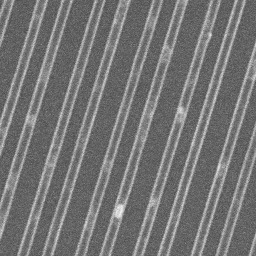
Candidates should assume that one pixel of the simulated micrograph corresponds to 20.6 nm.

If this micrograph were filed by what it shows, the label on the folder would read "parallel lines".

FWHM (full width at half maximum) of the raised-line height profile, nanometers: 192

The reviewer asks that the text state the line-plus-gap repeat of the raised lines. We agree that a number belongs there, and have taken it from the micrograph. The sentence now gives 27.4 px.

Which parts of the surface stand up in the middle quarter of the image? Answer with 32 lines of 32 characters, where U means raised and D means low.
DDDUUDDDDUUDDDDDDUUUDDDUUUDDDDDD
DDUUUDDDDUUDDDDDDUUDDDDUUUDDDDDU
DDUUUDDDUUUDDDDDDUUDDDDUUDDDDDDU
DDUUDDDDUUDDDDDDUUUDDDUUUDDDDDDU
DUUUDDDDUUDDDDDDUUDDDDUUUDDDDDDU
DUUUDDDUUUDDDDDDUUDDDDUUDDDDDDUU
DUUUDDDUUUDDDDDUUUDDDUUUDDDDDDUU
DUUDDDDUUDDDDDDUUUDDDUUUDDDDDDUU
DUUDDDDUUDDDDDDUUDDDDUUUDDDDDUUU
UUUDDDUUUDDDDDDUUDDDDUUDDDDDDUUD
UUDDDDUUDDDDDDUUUDDDUUUDDDDDDUUD
UUDDDDUUDDDDDDUUDDDDUUUDDDDDUUUD
UUDDDUUUDDDDDDUUDDDDUUDDDDDDUUUD
UDDDDUUDDDDDDUUUDDDUUUDDDDDDUUDD
UDDDDUUDDDDDDUUDDDDUUUDDDDDDUUDD
UDDDUUUDDDDDDUUDDDDUUDDDDDDUUUDD
DDDDUUUDDDDDUUUDDDDUUDDDDDDUUDDD
DDDDUUDDDDDDUUDDDDUUUDDDDDDUUDDD
DDDDUUDDDDDDUUDDDDUUDDDDDDUUUDDD
DDDUUUDDDDDUUUDDDDUUDDDDDDUUDDDD
DDDUUDDDDDDUUUDDDUUUDDDDDDUUDDDD
DDDUUDDDDDDUUDDDDUUUDDDDDUUUDDDU
DDUUUDDDDDDUUDDDDUUDDDDDDUUDDDDU
DDUUDDDDDDUUUDDDDUUDDDDDDUUDDDDU
DDUUDDDDDDUUDDDDUUUDDDDDUUUDDDDU
DUUUDDDDDDUUDDDDUUDDDDDDUUUDDDUU
DUUUDDDDDUUUDDDDUUDDDDDDUUDDDDUU
DUUDDDDDDUUDDDDUUUDDDDDDUUDDDDUU
UUUDDDDDDUUDDDDUUUDDDDDUUUDDDUUU
UUUDDDDDUUUDDDDUUDDDDDDUUDDDDUUD
UUUDDDDDUUUDDDUUUDDDDDDUUDDDDUUD
UUDDDDDDUUDDDDUUUDDDDDUUUDDDDUUD